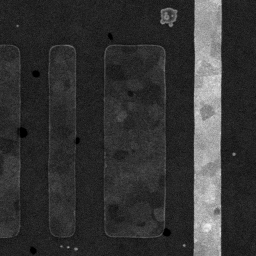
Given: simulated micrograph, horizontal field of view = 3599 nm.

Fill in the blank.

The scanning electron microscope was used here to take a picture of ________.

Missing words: groups of lines, slits or small figures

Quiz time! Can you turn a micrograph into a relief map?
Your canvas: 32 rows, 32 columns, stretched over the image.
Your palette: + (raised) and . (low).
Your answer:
........................++++....
....................++..++++....
....................++..++++....
........................++++....
........................++++....
........................++++....
++....+++....++++++++...++++....
++....+++....++++++++...++++....
++....+++....+++++++....++++....
++....+++....++++++++...++++....
++....+++....++++++++...++++....
++....+++....++++++++...++++....
++....+++....++++++++...++++....
++....+++....++++++++...++++....
++....+++....++++++++...++++....
++....+++....++++++++...++++....
++....+++....++++++++...++++....
++....+++....++++++++...++++....
++....+++....++++++++...+++.....
++....+++....++++++++...++++....
++....+++....++++++++...++++....
++....+++....++++++++...++++....
++....+++....++++++++...++++....
++....+++....++++++++...++++....
++....+++....++++++++...++++....
++....+++....++++++++...++++....
++....+++....+++++++....++++....
++....+++....+++++++....++++....
++....+++....+++++++....++++....
++.....++.....++++++....++++....
........................++++....
........................++++....